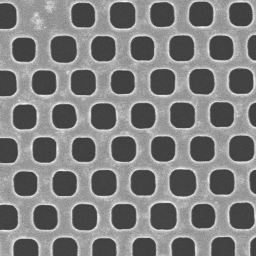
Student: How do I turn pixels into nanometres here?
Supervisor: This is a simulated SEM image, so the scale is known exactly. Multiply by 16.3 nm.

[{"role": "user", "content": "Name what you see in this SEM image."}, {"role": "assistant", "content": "a regular array of holes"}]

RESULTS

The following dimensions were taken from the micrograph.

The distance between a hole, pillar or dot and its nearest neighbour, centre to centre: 630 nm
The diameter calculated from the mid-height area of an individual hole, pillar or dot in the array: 436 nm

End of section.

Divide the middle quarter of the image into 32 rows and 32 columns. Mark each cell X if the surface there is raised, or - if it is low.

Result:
XXXXXXXXXXXXXXXXXXXXXXXXXXXXXXXX
XXX----XXXXXX---XXXXXXX---XXXXXX
XX------XXXX-----XXXXX------XXX-
XX------XXXX------XXX-------XXX-
XX------XXXX------XXX-------XXX-
XX------XXXX------XXX-------XXX-
XX------XXXX-----XXXXX-----XXXXX
XXX----XXXXXXX--XXXXXXX----XXXXX
XXXXXXXXXXXXXXXXXXXXXXXXXXXXXXXX
XXXXXXXXXXXXXXXXXXXXXXXXXXXX--XX
--XXXXX-----XXXXX-----XXXXX-----
---XXXX------XXXX------XXX------
---XXXX------XXXX------XXX------
---XXXX------XXXX------XXX------
---XXXX------XXXX------XXXX-----
--XXXXX------XXXX-----XXXXX-----
XXXXXXXXX--XXXXXXXXXXXXXXXXXXXXX
XXXXXXXXXXXXXXXXXXXXXXXXXXXXXXXX
XXX----XXXXXX----XXXXXX----XXXXX
XX------XXXX------XXXX------XXXX
XX------XXXX------XXXX------XXX-
XX------XXXX------XXXX------XXX-
XX------XXXX------XXXX------XXXX
XX------XXXX------XXXX-----XXXXX
XXXX--XXXXXXXX--XXXXXXXXX-XXXXXX
XXXXXXXXXXXXXXXXXXXXXXXXXXXXXXXX
XXXXXXXXX--XXXXXXXX--XXXXXX-----
---XXXX------XXXX------XXX------
---XXXX------XXXX------XXX------
---XXXX------XXX-------XXX------
---XXXX------XXX-------XXX------
---XXXX------XXXX------XXXX-----